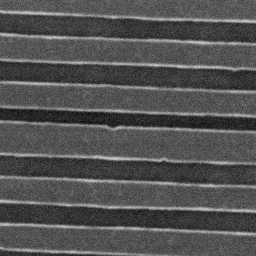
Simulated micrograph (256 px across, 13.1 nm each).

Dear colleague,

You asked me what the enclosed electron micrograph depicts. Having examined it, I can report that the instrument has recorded parallel lines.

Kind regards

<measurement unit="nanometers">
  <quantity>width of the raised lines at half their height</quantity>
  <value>347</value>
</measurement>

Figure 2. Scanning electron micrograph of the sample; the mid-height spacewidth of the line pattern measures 280 nanometers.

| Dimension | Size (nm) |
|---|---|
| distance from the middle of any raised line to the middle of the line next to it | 621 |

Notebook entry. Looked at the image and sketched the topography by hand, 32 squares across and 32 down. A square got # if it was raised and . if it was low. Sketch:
################################
################################
.......................#.#######
................................
###.............................
################################
################################
################################
..........................######
................................
#######.........................
################################
################################
.#..############################
...............................#
########........................
################################
################################
################################
....############################
................................
................................
##########......................
################################
################################
......##########################
................................
................................
##############.#................
################################
################################
........########################